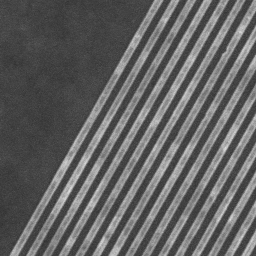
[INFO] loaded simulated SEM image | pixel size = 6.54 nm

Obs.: parallel lines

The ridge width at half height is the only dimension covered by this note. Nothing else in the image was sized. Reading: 39.7 nanometres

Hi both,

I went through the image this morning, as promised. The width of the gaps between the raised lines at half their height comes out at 56.9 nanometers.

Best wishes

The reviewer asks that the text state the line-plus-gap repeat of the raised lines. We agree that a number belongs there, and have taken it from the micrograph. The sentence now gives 93.9 nanometers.